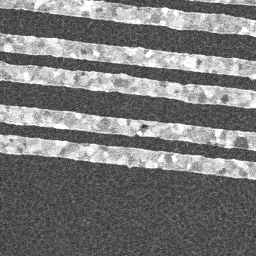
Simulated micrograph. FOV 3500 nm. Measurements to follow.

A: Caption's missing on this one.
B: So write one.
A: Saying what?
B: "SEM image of parallel lines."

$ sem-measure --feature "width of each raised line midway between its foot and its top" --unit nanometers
223